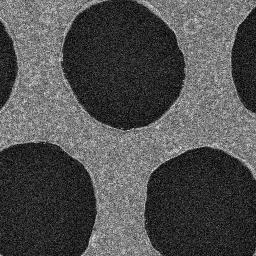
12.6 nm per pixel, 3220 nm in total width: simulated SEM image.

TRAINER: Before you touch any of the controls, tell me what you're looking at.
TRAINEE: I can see holes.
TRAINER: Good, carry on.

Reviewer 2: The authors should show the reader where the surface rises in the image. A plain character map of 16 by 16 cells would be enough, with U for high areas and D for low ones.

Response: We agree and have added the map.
UUUUUDDDDUUUUUUU
UUUUDDDDDDUUUUUD
DUUUDDDDDDDUUUUD
DUUUDDDDDDDUUUDD
DUUUDDDDDDDDUUUD
DUUUDDDDDDDUUUUD
UUUUUDDDDDDUUUUD
UUUUUUDDDDUUUUUU
UUUUUUUUUUUUUUUU
DDDDUUUUUUUDDDUU
DDDDDUUUUUDDDDDD
DDDDDDUUUDDDDDDD
DDDDDDUUUDDDDDDD
DDDDDDUUUDDDDDDD
DDDDDDUUUDDDDDDD
DDDDDUUUUUDDDDDD